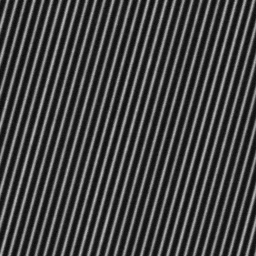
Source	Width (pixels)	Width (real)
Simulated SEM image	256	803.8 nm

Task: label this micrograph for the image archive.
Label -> parallel lines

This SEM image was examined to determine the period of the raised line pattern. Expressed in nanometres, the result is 26.6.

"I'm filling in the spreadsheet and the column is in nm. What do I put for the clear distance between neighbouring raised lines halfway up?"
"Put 20.1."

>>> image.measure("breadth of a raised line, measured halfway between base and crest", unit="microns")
0.0057